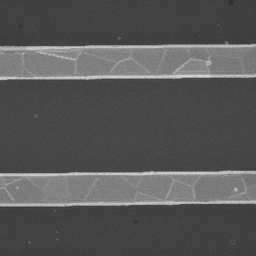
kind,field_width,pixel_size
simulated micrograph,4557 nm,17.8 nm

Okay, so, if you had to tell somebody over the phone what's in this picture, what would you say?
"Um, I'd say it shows lines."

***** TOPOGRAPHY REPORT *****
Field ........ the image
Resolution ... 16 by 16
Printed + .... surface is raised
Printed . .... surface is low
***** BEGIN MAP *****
................
................
................
++++++++++++++++
++++++++++++++++
................
................
................
................
................
................
++++++++++++++++
++++++++++++++++
................
................
................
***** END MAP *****